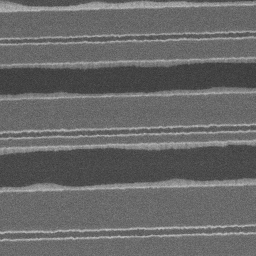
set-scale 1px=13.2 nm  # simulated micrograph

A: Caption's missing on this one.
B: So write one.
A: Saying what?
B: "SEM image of lines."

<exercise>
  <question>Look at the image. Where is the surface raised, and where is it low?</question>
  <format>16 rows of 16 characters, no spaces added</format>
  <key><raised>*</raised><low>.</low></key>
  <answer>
.....***********
****************
****************
****************
................
................
****************
****************
****************
................
................
..............**
****************
****************
****************
****************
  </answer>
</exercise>